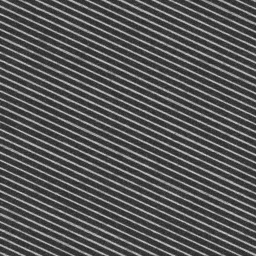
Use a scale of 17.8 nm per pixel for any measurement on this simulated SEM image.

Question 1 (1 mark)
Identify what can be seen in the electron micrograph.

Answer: parallel lines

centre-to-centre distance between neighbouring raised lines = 124 nm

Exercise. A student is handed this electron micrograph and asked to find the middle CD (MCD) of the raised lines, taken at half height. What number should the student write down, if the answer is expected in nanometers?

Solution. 24.2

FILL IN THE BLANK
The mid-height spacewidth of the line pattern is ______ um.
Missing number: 0.101